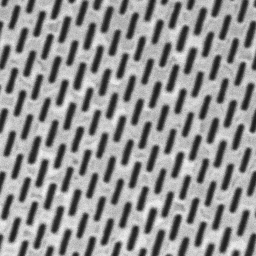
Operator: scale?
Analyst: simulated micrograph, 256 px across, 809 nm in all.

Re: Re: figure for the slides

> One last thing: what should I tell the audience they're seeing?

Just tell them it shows a regular array of holes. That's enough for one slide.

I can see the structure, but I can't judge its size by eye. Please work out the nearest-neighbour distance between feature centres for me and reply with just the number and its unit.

75.9 nm